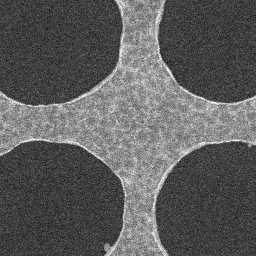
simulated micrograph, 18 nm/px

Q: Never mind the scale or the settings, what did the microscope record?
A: holes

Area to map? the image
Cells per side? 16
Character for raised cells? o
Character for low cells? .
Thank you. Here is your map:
.......ooo......
........oo......
........oo......
.......ooo......
.......oooo.....
......ooooo.....
oo.ooooooooooooo
oooooooooooooooo
oooooooooooooooo
......oooooo....
.......oooo.....
........oo......
........oo......
........oo......
........oo......
.......ooo......